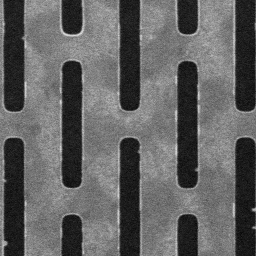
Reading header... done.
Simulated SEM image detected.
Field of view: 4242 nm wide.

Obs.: groups of lines, slits or small figures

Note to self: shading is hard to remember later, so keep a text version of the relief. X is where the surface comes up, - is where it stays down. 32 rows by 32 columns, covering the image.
---XXXXX--XXXXX---XXXX---XXXX---
---XXXXX--XXXXX---XXXX---XXXX---
---XXXXX--XXXXX---XXXX---XXXX---
---XXXXX--XXXXX---XXXX---XXXX---
---XXXXXXXXXXXX---XXXXXXXXXXX---
---XXXXXXXXXXXX---XXXXXXXXXXX---
---XXXXXXXXXXXX---XXXXXXXXXXX---
---XXXXXXXXXXXX---XXXXX-XXXXX---
---XXXXX--XXXXX---XXXX---XXXX---
---XXXXX--XXXXX---XXXX---XXXX---
---XXXXX--XXXXX---XXXX---XXXX---
---XXXXX--XXXXX---XXXX---XXXX---
---XXXXX--XXXXX---XXXX---XXXX---
X--XXXXX--XXXXX--XXXXX---XXXXX--
XXXXXXXX--XXXXXXXXXXXX---XXXXXXX
XXXXXXXX--XXXXXXXXXXXX---XXXXXXX
XXXXXXXX--XXXXXXXXXXXX---XXXXXXX
X--XXXXX--XXXXX--XXXXX---XXXXX--
---XXXXX--XXXXX---XXXX---XXXX---
---XXXXX--XXXXX--XXXXX---XXXX---
---XXXXX--XXXXX---XXXX---XXXX---
---XXXXX--XXXXX---XXXX---XXXX---
---XXXXX--XXXXX---XXXX---XXXX---
---XXXXX--XXXXX---XXXXX-XXXXX---
---XXXXXXXXXXXX---XXXXXXXXXXX---
---XXXXXXXXXXXX---XXXXXXXXXXX---
---XXXXXXXXXXXX---XXXXXXXXXXX---
---XXXXX--XXXXX---XXXX---XXXX---
---XXXXX--XXXXX---XXXX---XXXX---
---XXXXX--XXXXX---XXXX---XXXX---
X--XXXXX--XXXXX---XXXX---XXXX---
---XXXXX--XXXXX---XXXX---XXXX---